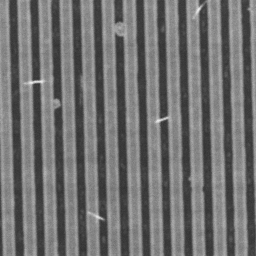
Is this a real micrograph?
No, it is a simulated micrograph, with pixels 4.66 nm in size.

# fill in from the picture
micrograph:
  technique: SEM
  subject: parallel lines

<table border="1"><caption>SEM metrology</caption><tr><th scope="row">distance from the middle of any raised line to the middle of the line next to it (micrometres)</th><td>0.0984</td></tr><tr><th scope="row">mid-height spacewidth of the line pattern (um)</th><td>0.0513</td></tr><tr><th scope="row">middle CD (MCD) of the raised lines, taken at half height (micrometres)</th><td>0.0466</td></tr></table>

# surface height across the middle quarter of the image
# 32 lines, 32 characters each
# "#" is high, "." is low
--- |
##...##...##....##...##...##...#
##...##...##....##...##...##...#
##...##...##....##...##...###..#
##...##...##....##...##...###...
##...##...###...##...##...###...
##...##...###...##...##...##....
##...###..###...##...##...###...
##...###...##...##...##...###...
##...##....##...##...##...###...
##...##....##...##...##...###...
##...##....##...##...##...###...
##...##....##...##...##...###...
##...##....##...##...##...###...
##...###...##...##...##....##...
##...###...##...##...###...##...
##...###...##...##...##....##...
##...###...##...##...###...##...
###...##...##...##...###...##...
###...##...##...##...###...##...
###...##...##...##...###...##...
##....##...##...##...###...##...
###...##...##...##...###...##...
###...##...##...##...###...##...
##....##...##...###...##...##...
##....##...##...###...##...##...
###...##...##...###...##...##...
###...##...##...###...##...##...
###...##...##...###...##...##...
.##...##...##...###...##...##...
.##...##...##...###...##...##...
.##...##...##...###...##...##...
.##...##...##...###...##...##...